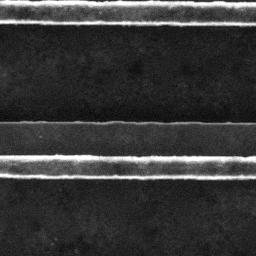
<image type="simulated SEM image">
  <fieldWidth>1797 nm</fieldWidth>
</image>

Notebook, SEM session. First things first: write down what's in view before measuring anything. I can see lines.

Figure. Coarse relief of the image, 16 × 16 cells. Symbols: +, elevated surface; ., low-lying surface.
++++++++++++++++
.........+++++++
................
................
................
................
................
................
++++++++++++++++
++++++++++++++++
++++++++++++++++
................
................
................
................
................